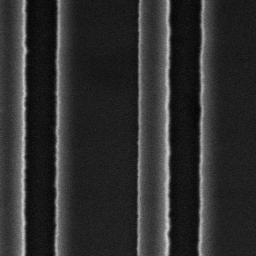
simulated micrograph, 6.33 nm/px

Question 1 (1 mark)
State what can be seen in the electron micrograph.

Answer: lines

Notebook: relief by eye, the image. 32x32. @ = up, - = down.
@@@----@@@@@@@@@@@@@@----@@@@@@@
@@@----@@@@@@@@@@@@@@----@@@@@@@
@@@----@@@@@@@@@@@@@@----@@@@@@@
@@@----@@@@@@@@@@@@@@----@@@@@@@
@@@----@@@@@@@@@@@@@@----@@@@@@@
@@@----@@@@@@@@@@@@@@----@@@@@@@
@@@----@@@@@@@@@@@@@@----@@@@@@@
@@@----@@@@@@@@@@@@@@----@@@@@@@
@@@----@@@@@@@@@@@@@@----@@@@@@@
@@@----@@@@@@@@@@@@@@----@@@@@@@
@@@----@@@@@@@@@@@@@@----@@@@@@@
@@@----@@@@@@@@@@@@@@----@@@@@@@
@@@----@@@@@@@@@@@@@@----@@@@@@@
@@@----@@@@@@@@@@@@@@----@@@@@@@
@@@----@@@@@@@@@@@@@@----@@@@@@@
@@@----@@@@@@@@@@@@@@----@@@@@@@
@@@----@@@@@@@@@@@@@@----@@@@@@@
@@@----@@@@@@@@@@@@@@----@@@@@@@
@@@----@@@@@@@@@@@@@@----@@@@@@@
@@@----@@@@@@@@@@@@@@----@@@@@@@
@@@----@@@@@@@@@@@@@@----@@@@@@@
@@@----@@@@@@@@@@@@@@----@@@@@@@
@@@----@@@@@@@@@@@@@@----@@@@@@@
@@@----@@@@@@@@@@@@@@----@@@@@@@
@@@----@@@@@@@@@@@@@@----@@@@@@@
@@@----@@@@@@@@@@@@@@----@@@@@@@
@@@----@@@@@@@@@@@@@@----@@@@@@@
@@@----@@@@@@@@@@@@@@----@@@@@@@
@@@----@@@@@@@@@@@@@@----@@@@@@@
@@@----@@@@@@@@@@@@@@----@@@@@@@
@@@----@@@@@@@@@@@@@@----@@@@@@@
@@@----@@@@@@@@@@@@@@----@@@@@@@